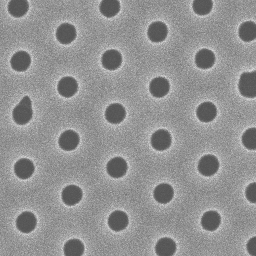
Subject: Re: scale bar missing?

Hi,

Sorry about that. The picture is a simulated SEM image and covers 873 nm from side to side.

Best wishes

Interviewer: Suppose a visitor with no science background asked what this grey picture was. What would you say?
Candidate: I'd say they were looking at a regular array of holes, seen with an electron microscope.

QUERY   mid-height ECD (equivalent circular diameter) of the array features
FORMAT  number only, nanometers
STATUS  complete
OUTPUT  67.9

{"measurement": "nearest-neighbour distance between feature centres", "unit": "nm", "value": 180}